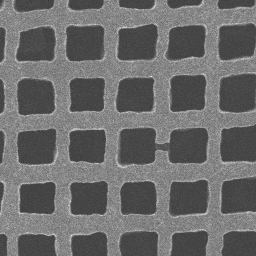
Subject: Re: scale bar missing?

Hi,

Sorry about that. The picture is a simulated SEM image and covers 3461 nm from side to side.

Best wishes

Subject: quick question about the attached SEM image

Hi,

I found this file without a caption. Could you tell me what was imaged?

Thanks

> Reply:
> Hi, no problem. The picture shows a regular array of holes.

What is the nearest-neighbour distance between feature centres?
669 nm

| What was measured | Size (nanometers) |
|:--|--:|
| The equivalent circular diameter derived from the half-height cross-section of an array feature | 525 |